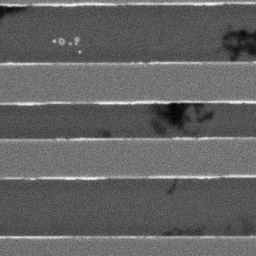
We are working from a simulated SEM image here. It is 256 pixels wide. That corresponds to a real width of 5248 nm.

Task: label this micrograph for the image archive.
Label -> lines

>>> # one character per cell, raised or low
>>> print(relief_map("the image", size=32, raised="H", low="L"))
HHHHHHHHHLLLLLLLLLLLLLLLLLLLLLLL
LLLLLLLLLLLLLLLLLLLLLLLLLLLLLLLL
LLLLLLLLLLLLLLLLLLLLLLLLLLLLLLLL
LLLLLLLLLLLLLLLLLLLLLLLLLLLLLLLL
LLLLLLLLLLLLLLLLLLLLLLLLLLLLLLLL
LLLLLLLLLLLLLLLLLLLLLLLLLLLLLLLL
LLLLLLLLLLLLLLLLLLLLLLLLLLLLLLLL
LLLLLLLLLLLLLLLLLLLLLLLLLLLLLLLL
HHHHHHHHHHHHHHHHHHHHHHHHHHHHHHHH
HHHHHHHHHHHHHHHHHHHHHHHHHHHHHHHH
HHHHHHHHHHHHHHHHHHHHHHHHHHHHHHHH
HHHHHHHHHHHHHHHHHHHHHHHHHHHHHHHH
HHHHHHHHHHHHHHHHHHHHHHHHHHHHHHHH
LLLLLLLLLLLLLLLLLLLLLLLLLLLLLLLL
LLLLLLLLLLLLLLLLLLLLLLLLLLLLLLLL
LLLLLLLLLLLLLLLLLLLLLLLLLLLLLLLL
LLLLLLLLLLLLLLLLLLLLLLLLLLLLLLLL
LLLLLLLHHHHHHHHHHHHHHHHHHHHHHHHH
HHHHHHHHHHHHHHHHHHHHHHHHHHHHHHHH
HHHHHHHHHHHHHHHHHHHHHHHHHHHHHHHH
HHHHHHHHHHHHHHHHHHHHHHHHHHHHHHHH
HHHHHHHHHHHHHHHHHHHHHHHHHHHHHHHH
LLLLLLLLLLLLLLLLLLLLLLLLLLLLLLLL
LLLLLLLLLLLLLLLLLLLLLLLLLLLLLLLL
LLLLLLLLLLLLLLLLLLLLLLLLLLLLLLLL
LLLLLLLLLLLLLLLLLLLLLLLLLLLLLLLL
LLLLLLLLLLLLLLLLLLLLLLLLLLLLLLLL
LLLLLLLLLLLLLLLLLLLLLLLLLLLLLLLL
LLLLLLLLLLLLLLLLLLLLLLLLLLLLLLLL
LLLLLLLLLLLLLLLLLLLLLLLLLLLLLLLL
HHHHHHHHHHHHHHHHHHHHHHHHHHHHHHHH
HHHHHHHHHHHHHHHHHHHHHHHHHHHHHHHH